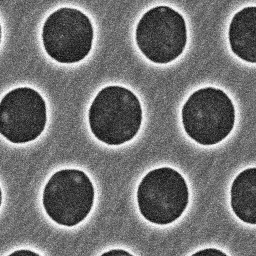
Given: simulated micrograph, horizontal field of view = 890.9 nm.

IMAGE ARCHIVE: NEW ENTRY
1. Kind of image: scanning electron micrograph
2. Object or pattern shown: holes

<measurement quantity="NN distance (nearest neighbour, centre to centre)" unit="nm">324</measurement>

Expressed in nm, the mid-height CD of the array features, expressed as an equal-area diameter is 190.